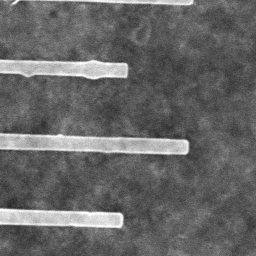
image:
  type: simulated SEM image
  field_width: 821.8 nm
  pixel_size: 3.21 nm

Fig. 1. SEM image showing one or a few lines or trenches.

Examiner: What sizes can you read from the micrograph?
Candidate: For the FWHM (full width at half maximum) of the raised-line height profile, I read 0.0461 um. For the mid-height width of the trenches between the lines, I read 195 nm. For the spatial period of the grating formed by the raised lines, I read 239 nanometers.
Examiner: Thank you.